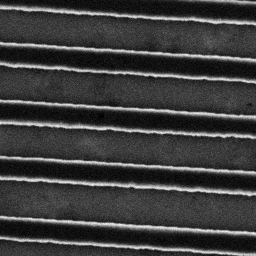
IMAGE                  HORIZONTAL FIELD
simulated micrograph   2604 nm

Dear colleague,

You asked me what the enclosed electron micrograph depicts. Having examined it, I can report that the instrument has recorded lines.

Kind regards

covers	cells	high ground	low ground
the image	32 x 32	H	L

HHHHHHHHHHHHHHHHHHHHHHHHHHHHHHHH
LLLLLLLHHHHHHHHHHHHHHHHHHHHHHHHH
LLLLLLLLLLLLLLLLLLLLLLLLHHHHHHHH
LLLLLLLLLLLLLLLLLLLLLLLLLLLLLLLL
LLLLLLLLLLLLLLLLLLLLLLLLLLLLLLLL
HLLLLLLLLLLLLLLLLLLLLLLLLLLLLLLL
HHHHHHHHHHHHHHHHHHHLLLLLLLLLLLLL
HHHHHHHHHHHHHHHHHHHHHHHHHHHHHHHH
LLLLLHHHHHHHHHHHHHHHHHHHHHHHHHHH
LLLLLLLLLLLLLLLLLLLHHHHHHHHHHHHH
LLLLLLLLLLLLLLLLLLLLLLLLLLLLLLLL
LLLLLLLLLLLLLLLLLLLLLLLLLLLLLLLL
LLLLLLLLLLLLLLLLLLLLLLLLLLLLLLLL
HHHHHHHHHHHHHHHHLLLLLLLLLLLLLLLL
HHHHHHHHHHHHHHHHHHHHHHHHHHHHHLLL
LLLHHHHHHHHHHHHHHHHHHHHHHHHHHHHH
LLLLLLLLLLLLLLLLLHHHHHHHHHHHHHHH
LLLLLLLLLLLLLLLLLLLLLLLLLLLLLLLL
LLLLLLLLLLLLLLLLLLLLLLLLLLLLLLLL
LLLLLLLLLLLLLLLLLLLLLLLLLLLLLLLL
HHHHHHHHHHHHHHHLLLLLLLLLLLLLLLLL
HHHHHHHHHHHHHHHHHHHHHHHHHHHHHHHL
LLLHHHHHHHHHHHHHHHHHHHHHHHHHHHHH
LLLLLLLLLLLLLLLLLLLLHHHHHHHHHHHH
LLLLLLLLLLLLLLLLLLLLLLLLLLLLLLLL
LLLLLLLLLLLLLLLLLLLLLLLLLLLLLLLL
LLLLLLLLLLLLLLLLLLLLLLLLLLLLLLLL
HHHHHHLLLLLLLLLLLLLLLLLLLLLLLLLL
HHHHHHHHHHHHHHHHHHHHHLLLLLLLLLLL
HHHHHHHHHHHHHHHHHHHHHHHHHHHHHHHH
LLLLLLLLLHHHHHHHHHHHHHHHHHHHHHHH
LLLLLLLLLLLLLLLLLLLLLLLLHHHHHHHH